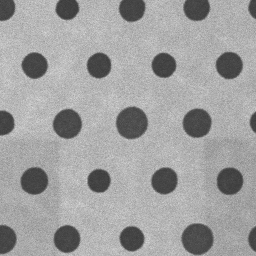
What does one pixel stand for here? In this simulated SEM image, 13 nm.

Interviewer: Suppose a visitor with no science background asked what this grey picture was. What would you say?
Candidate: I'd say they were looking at a regular array of holes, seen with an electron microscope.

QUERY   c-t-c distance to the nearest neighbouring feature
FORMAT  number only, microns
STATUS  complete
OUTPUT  0.842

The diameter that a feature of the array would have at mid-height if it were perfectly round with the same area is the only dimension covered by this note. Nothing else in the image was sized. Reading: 348 nm